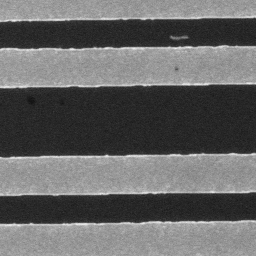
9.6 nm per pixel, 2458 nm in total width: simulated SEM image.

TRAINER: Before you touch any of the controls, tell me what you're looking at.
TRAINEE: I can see lines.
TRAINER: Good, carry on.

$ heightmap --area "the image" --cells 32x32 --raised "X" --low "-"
XXXXXXXXXXXXXXXXXXXXXXXXXXXXXXXX
XXXXXXXXXXXXXXXXXXXXXXXXXXXXXXXX
XXXXXXXXX-----------------------
--------------------------------
--------------------------------
--------------------------------
XXXXXXXXXXXXXXXXXXXXXXXXXXXXXXXX
XXXXXXXXXXXXXXXXXXXXXXXXXXXXXXXX
XXXXXXXXXXXXXXXXXXXXXXXXXXXXXXXX
XXXXXXXXXXXXXXXXXXXXXXXXXXXXXXXX
XXXXXXXXXXXXXXXXXXXXXXXXXX------
--------------------------------
--------------------------------
--------------------------------
--------------------------------
--------------------------------
--------------------------------
--------------------------------
--------------------------------
-------------X-XXXXXXXXXXXXXXXXX
XXXXXXXXXXXXXXXXXXXXXXXXXXXXXXXX
XXXXXXXXXXXXXXXXXXXXXXXXXXXXXXXX
XXXXXXXXXXXXXXXXXXXXXXXXXXXXXXXX
XXXXXXXXXXXXXXXXXXXXXXXXXXXXXXXX
--------------------------------
--------------------------------
--------------------------------
--------------------------------
XXXXXXXXXXXXXXXXXXXXXXXXXXXXXXXX
XXXXXXXXXXXXXXXXXXXXXXXXXXXXXXXX
XXXXXXXXXXXXXXXXXXXXXXXXXXXXXXXX
XXXXXXXXXXXXXXXXXXXXXXXXXXXXXXXX